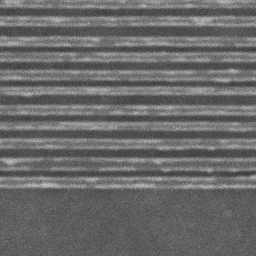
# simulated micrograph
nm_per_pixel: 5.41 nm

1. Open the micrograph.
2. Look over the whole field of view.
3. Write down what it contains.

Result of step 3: parallel lines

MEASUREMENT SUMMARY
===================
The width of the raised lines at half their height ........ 9.37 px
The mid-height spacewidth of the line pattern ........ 8.61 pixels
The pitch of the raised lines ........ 96.6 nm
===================